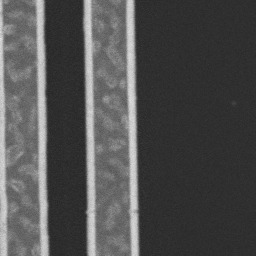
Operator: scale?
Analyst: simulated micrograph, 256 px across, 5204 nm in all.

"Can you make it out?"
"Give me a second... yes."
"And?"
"one or a few lines or trenches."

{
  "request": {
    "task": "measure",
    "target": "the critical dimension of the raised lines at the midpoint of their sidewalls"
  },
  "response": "836 nm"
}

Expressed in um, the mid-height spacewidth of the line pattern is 0.973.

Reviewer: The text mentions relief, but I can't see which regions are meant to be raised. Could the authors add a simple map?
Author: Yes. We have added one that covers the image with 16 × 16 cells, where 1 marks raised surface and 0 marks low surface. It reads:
1100001100000000
1100001100000000
1110001100000000
1110001100000000
1110001100000000
1110001100000000
1110001100000000
1110001100000000
1110001100000000
1110001100000000
1110001100000000
1110001100000000
1110001100000000
1110001100000000
1110001100000000
1110001100000000